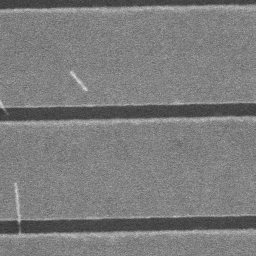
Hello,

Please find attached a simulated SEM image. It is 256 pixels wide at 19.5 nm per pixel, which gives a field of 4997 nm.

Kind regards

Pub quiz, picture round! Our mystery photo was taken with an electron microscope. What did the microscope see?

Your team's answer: lines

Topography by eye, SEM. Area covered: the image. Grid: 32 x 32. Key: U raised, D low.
DDDDDDDDDDDDDDDDDDDDDDDDDDDDDDDD
UUUUUUUUUUUUUUUUUUUUUUUUUUUUUUUU
UUUUUUUUUUUUUUUUUUUUUUUUUUUUUUUU
UUUUUUUUUUUUUUUUUUUUUUUUUUUUUUUU
UUUUUUUUUUUUUUUUUUUUUUUUUUUUUUUU
UUUUUUUUUUUUUUUUUUUUUUUUUUUUUUUU
UUUUUUUUUUUUUUUUUUUUUUUUUUUUUUUU
UUUUUUUUUUUUUUUUUUUUUUUUUUUUUUUU
UUUUUUUUUUUUUUUUUUUUUUUUUUUUUUUU
UUUUUUUUUUUUUUUUUUUUUUUUUUUUUUUU
UUUUUUUUUUUUUUUUUUUUUUUUUUUUUUUU
UUUUUUUUUUUUUUUUUUUUUUUUUUUUUUUU
UUUUUUUUUUUUUUUUUUUUUUUUUUUUUUUU
DDDDDDDDDDDDDDDDDDDDDDDDDDDDDDDD
DDDDDDDDDDDDDDDDDDDDDDDDDDDDDDDD
UUUUUUUUUUUUUUUUUUUUUUUUUUUUUUUU
UUUUUUUUUUUUUUUUUUUUUUUUUUUUUUUU
UUUUUUUUUUUUUUUUUUUUUUUUUUUUUUUU
UUUUUUUUUUUUUUUUUUUUUUUUUUUUUUUU
UUUUUUUUUUUUUUUUUUUUUUUUUUUUUUUU
UUUUUUUUUUUUUUUUUUUUUUUUUUUUUUUU
UUUUUUUUUUUUUUUUUUUUUUUUUUUUUUUU
UUUUUUUUUUUUUUUUUUUUUUUUUUUUUUUU
UUUUUUUUUUUUUUUUUUUUUUUUUUUUUUUU
UUUUUUUUUUUUUUUUUUUUUUUUUUUUUUUU
UUUUUUUUUUUUUUUUUUUUUUUUUUUUUUUU
UUUUUUUUUUUUUUUUUUUUUUUUUUUUUUUU
UUUDDDDDDDDDDDDDDDDDDDDDDDDDDDDD
DDDDDDDDDDDDDDDDDDDDDDDDDDDDDDDD
UUUUUUUUUUUUUUUUUUUUUUUUUUUUUUUU
UUUUUUUUUUUUUUUUUUUUUUUUUUUUUUUU
UUUUUUUUUUUUUUUUUUUUUUUUUUUUUUUU